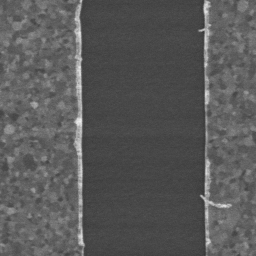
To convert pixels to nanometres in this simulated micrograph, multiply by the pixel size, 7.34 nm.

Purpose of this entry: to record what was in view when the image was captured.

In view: one or a few lines or trenches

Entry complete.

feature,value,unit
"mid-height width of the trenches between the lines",904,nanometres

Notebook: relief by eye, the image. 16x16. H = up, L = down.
HHHHHLLLLLLLLHHH
HHHHHLLLLLLLLHHH
HHHHHLLLLLLLLHHH
HHHHHLLLLLLLLHHH
HHHHHLLLLLLLLHHH
HHHHHLLLLLLLLHHH
HHHHHLLLLLLLLHHH
HHHHHLLLLLLLLHHH
HHHHHLLLLLLLLHHH
HHHHHLLLLLLLLHHH
HHHHHLLLLLLLLHHH
HHHHHLLLLLLLLHHH
HHHHHLLLLLLLLHHH
HHHHHLLLLLLLLHHH
HHHHHLLLLLLLLHHH
HHHHHLLLLLLLLHHH